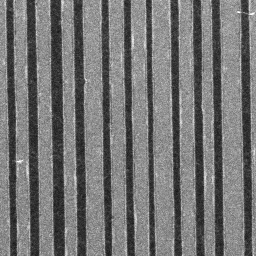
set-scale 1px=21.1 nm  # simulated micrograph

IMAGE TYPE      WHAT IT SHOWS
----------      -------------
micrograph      parallel lines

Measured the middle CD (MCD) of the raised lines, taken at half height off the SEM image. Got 210 nm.